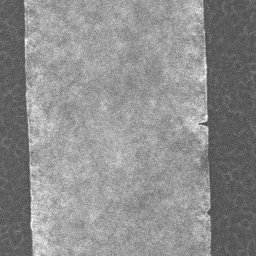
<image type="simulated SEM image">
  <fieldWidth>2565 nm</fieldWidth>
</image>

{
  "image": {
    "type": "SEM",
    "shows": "one or a few lines or trenches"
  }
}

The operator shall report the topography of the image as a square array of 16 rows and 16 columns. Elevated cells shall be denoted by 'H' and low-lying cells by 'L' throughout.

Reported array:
LLHHHHHHHHHHHLLL
LLHHHHHHHHHHHLLL
LLHHHHHHHHHHHLLL
LLHHHHHHHHHHHLLL
LLHHHHHHHHHHHLLL
LLHHHHHHHHHHHLLL
LLHHHHHHHHHHHLLL
LLHHHHHHHHHHHLLL
LLHHHHHHHHHHHLLL
LLHHHHHHHHHHHLLL
LLHHHHHHHHHHHLLL
LLHHHHHHHHHHHLLL
LLHHHHHHHHHHHLLL
LLHHHHHHHHHHHLLL
LLHHHHHHHHHHHLLL
LLHHHHHHHHHHHLLL